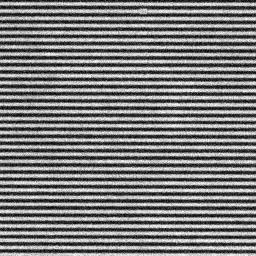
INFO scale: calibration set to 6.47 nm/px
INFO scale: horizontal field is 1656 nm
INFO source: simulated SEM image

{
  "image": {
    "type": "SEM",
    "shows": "parallel lines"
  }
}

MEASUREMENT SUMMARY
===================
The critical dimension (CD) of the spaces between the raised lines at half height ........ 24.3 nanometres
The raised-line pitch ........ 46.4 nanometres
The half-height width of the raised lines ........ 0.0186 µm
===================